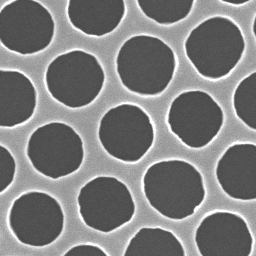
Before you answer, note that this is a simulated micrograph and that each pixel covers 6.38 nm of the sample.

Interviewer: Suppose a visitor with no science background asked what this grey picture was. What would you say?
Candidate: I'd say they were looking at a regular array of holes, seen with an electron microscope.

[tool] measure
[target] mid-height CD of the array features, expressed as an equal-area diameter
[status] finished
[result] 355 nm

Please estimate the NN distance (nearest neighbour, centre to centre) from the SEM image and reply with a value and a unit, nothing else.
451 nanometers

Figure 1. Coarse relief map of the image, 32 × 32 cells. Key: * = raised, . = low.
*....****.......*.......*****.**
......**........**......********
.......**......****....***...***
.......***....**********......**
.......**********.******......**
......*********......**........*
**...****.*****.......*.......**
*******.....***.......**......**
******.......**.......**.....***
...***.......**.......***...***.
....**.......**......*********..
....**......*****...***..****...
.....**.....**********.....**...
....**********...****.......*...
....*********.....***.......**..
..****..*****......**.......***.
****.....***.......***.....*****
****......**.......****...******
.**.......***......**********...
..**......****....**********....
..**......*********.....***.....
..***....*********.......**.....
..*********....***.......**.....
.*********......**.......***....
***...****......**........***...
**.....***.......**......*******
*.......**.......***....********
*.......**......*********.....**
*.......****...***.******......*
**.....**********.....**.......*
***...**********.......**.......
********.....***.......**......*